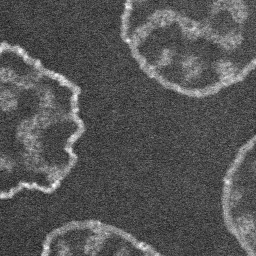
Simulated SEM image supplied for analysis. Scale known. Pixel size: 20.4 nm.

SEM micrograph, raised bodies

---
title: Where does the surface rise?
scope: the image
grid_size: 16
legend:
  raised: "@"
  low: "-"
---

--------@@@@@@@@
--------@@@@@@@@
--------@@@@@@@@
@--------@@@@@@@
@@@------@@@@@@-
@@@@-------@@---
@@@@@-----------
@@@@@-----------
@@@@@-----------
@@@@-----------@
@@@@-----------@
@@@-----------@@
--------------@@
--------------@@
----@@@--------@
---@@@@@@-------